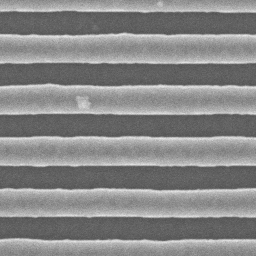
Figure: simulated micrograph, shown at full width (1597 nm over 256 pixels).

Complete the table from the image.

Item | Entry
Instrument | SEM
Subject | lines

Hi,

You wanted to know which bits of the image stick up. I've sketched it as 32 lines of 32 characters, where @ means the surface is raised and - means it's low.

@@@@@@@@@@@@@@@@@@@@@@@@@@@@@@@@
-----------------@@------@-@@@@@
--------------------------------
--------------------------------
@@@@@@@@@@@@@@@@@@@@@@@@@@@@@@@@
@@@@@@@@@@@@@@@@@@@@@@@@@@@@@@@@
@@@@@@@@@@@@@@@@@@@@@@@@@@@@@@@@
@@@@@@@@@@@@@@@@@@@@@@@@@@@@@@@@
--------------------------------
--------------------------------
-----@@-------------------------
@@@@@@@@@@@@@@@@@@@@@@@@@@@@@@@@
@@@@@@@@@@@@@@@@@@@@@@@@@@@@@@@@
@@@@@@@@@@@@@@@@@@@@@@@@@@@@@@@@
--------------------------------
--------------------------------
--------------------------------
@@@@@@@@@@@@@@@@@@@@@@@@@@@@@@@@
@@@@@@@@@@@@@@@@@@@@@@@@@@@@@@@@
@@@@@@@@@@@@@@@@@@@@@@@@@@@@@@@@
@@@@@@@@@@@@@@@@@@@@@@@@@@@@@@@@
--------------------------------
--------------------------------
--------------------------------
@@@@@@@@@@@@@@@@@@@@@@@@@@@@@@@@
@@@@@@@@@@@@@@@@@@@@@@@@@@@@@@@@
@@@@@@@@@@@@@@@@@@@@@@@@@@@@@@@@
--------------------------------
--------------------------------
--------------------------------
@@@@@@@@@@@@@@@@@@@@@@@@@@@@@@@@
@@@@@@@@@@@@@@@@@@@@@@@@@@@@@@@@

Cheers